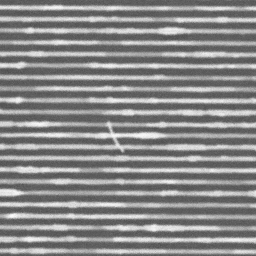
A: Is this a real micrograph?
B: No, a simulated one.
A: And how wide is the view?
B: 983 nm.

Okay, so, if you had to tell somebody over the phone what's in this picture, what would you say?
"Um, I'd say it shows parallel lines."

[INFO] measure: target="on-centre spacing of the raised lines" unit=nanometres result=44.5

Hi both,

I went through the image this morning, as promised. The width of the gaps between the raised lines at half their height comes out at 31.2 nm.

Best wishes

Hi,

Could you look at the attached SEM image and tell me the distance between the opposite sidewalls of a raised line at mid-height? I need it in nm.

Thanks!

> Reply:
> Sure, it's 12.5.